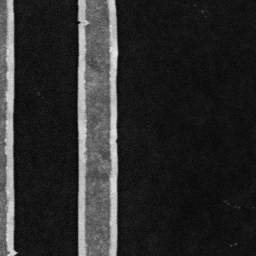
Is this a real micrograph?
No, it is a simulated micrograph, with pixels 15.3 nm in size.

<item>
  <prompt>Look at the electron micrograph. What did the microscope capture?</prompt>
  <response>one or a few lines or trenches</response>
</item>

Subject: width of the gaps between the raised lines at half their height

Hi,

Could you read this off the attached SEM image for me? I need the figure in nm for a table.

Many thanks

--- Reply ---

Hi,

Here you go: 1080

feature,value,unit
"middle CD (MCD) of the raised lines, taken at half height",490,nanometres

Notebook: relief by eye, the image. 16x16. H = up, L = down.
HLLLLHHLLLLLLLLL
HLLLLHHLLLLLLLLL
HLLLLHHLLLLLLLLL
HLLLLHHLLLLLLLLL
HLLLLHHLLLLLLLLL
HLLLLHHLLLLLLLLL
HLLLLHHLLLLLLLLL
HLLLLHHLLLLLLLLL
HLLLLHHLLLLLLLLL
HLLLLHHLLLLLLLLL
HLLLLHHLLLLLLLLL
HLLLLHHLLLLLLLLL
HLLLLHHLLLLLLLLL
HLLLLHHLLLLLLLLL
HLLLLHHLLLLLLLLL
HLLLLHHLLLLLLLLL